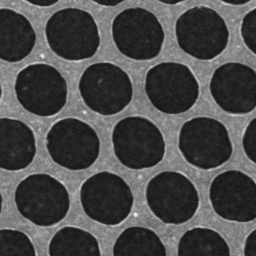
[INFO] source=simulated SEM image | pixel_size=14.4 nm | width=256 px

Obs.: a regular array of holes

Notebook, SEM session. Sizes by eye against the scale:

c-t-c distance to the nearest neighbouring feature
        63.3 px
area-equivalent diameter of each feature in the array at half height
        768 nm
